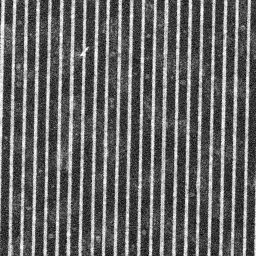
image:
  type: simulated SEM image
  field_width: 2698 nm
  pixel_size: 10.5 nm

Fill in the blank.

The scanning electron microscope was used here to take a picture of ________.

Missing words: parallel lines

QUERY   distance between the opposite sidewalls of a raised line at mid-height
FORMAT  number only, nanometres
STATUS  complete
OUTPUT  26.4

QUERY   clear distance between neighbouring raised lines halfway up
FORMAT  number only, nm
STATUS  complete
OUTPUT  98.8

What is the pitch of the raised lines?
124 nm